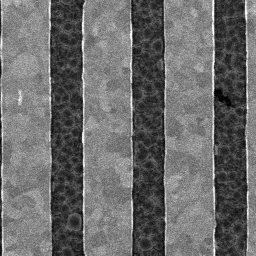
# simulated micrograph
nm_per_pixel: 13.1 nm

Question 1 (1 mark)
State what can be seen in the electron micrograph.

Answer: one or a few lines or trenches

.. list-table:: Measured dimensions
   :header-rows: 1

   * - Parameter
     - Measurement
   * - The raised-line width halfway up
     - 0.633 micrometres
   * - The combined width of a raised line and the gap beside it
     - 1070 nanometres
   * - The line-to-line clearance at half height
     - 429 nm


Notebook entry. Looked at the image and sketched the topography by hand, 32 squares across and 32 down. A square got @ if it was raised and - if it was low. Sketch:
@@@@@@-----@@@@@-----@@@@@@----@
@@@@@@-----@@@@@-----@@@@@@----@
@@@@@@----@@@@@@-----@@@@@@----@
@@@@@@----@@@@@@-----@@@@@@----@
@@@@@@----@@@@@@-----@@@@@@----@
@@@@@@----@@@@@@----@@@@@@@----@
@@@@@@----@@@@@@-----@@@@@@----@
@@@@@@----@@@@@@-----@@@@@@----@
@@@@@@----@@@@@@-----@@@@@@----@
@@@@@@----@@@@@@-----@@@@@@----@
@@@@@@----@@@@@@-----@@@@@@----@
@@@@@@----@@@@@@-----@@@@@@----@
@@@@@@----@@@@@@-----@@@@@@----@
@@@@@@----@@@@@@-----@@@@@@----@
@@@@@@----@@@@@@-----@@@@@@----@
@@@@@@----@@@@@@@----@@@@@@----@
@@@@@@----@@@@@@-----@@@@@@----@
@@@@@@----@@@@@@-----@@@@@@----@
@@@@@@----@@@@@@@----@@@@@@----@
@@@@@@----@@@@@@@----@@@@@@----@
@@@@@@----@@@@@@@----@@@@@@----@
@@@@@@----@@@@@@@----@@@@@@----@
@@@@@@----@@@@@@@----@@@@@@----@
@@@@@@----@@@@@@@----@@@@@@----@
@@@@@@----@@@@@@-----@@@@@@----@
@@@@@@----@@@@@@-----@@@@@@----@
@@@@@@----@@@@@@@----@@@@@@----@
@@@@@@---@@@@@@@@----@@@@@@----@
@@@@@@---@@@@@@@@----@@@@@@----@
@@@@@@-----@@@@@-----@@@@@@----@
@@@@@@-----@@@@@-----@@@@@@----@
@@@@@@-----@@@@@-----@@@@@@----@